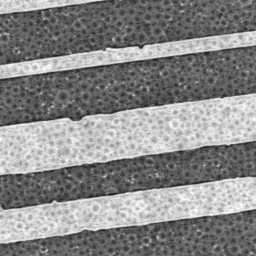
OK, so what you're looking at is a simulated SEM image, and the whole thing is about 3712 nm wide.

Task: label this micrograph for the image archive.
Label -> one or a few lines or trenches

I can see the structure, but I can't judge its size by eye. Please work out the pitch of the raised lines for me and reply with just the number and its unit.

1110 nm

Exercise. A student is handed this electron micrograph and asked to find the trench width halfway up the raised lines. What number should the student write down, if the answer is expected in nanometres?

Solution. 703